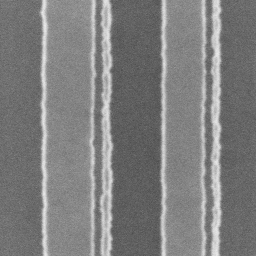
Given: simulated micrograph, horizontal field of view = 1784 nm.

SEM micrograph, lines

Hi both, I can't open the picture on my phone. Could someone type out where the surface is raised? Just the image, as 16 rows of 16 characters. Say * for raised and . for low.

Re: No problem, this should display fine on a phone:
...****...****..
...****...****..
...****...****..
...****...****..
...****...****..
...****...****..
...****...****..
...****...****..
...****...****..
...****...****..
...****...****..
...****...****..
...****...****..
...****...****..
...****...****..
...****...****..